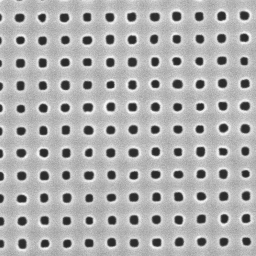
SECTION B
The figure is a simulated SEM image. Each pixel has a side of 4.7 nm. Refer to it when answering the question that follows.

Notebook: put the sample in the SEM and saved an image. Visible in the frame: a regular array of holes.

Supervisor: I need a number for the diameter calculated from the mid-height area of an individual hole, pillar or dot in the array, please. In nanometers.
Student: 44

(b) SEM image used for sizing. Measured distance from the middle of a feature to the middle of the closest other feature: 22 pixels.